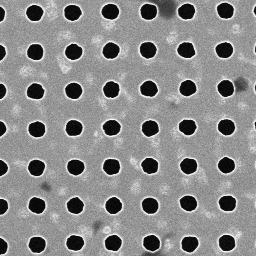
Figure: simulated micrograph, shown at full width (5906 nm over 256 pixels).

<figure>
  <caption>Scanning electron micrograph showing a regular array of holes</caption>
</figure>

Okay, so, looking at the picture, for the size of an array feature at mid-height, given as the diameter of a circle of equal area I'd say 389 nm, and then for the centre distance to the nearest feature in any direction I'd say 37.6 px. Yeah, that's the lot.